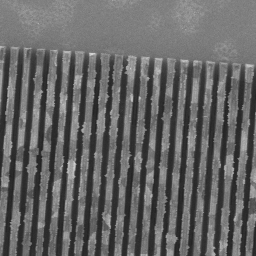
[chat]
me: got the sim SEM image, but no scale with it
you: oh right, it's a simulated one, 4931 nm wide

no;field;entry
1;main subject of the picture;parallel lines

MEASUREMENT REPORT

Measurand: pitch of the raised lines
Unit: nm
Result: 251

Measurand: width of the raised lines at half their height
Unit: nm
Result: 146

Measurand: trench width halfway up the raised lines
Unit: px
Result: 5.86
